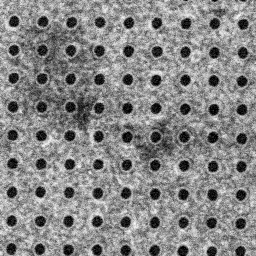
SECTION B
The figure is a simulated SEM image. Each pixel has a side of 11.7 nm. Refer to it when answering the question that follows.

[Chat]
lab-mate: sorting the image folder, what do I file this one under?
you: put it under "a regular array of holes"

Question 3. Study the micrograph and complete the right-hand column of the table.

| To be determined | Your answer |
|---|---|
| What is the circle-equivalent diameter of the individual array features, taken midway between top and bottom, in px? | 12.1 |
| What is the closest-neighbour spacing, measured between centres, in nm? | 331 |